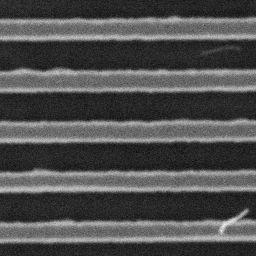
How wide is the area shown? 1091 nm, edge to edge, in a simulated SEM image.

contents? lines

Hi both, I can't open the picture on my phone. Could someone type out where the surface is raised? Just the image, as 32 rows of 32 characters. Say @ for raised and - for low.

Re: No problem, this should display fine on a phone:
--------------------------------
--------------------------------
-------------@@--@@@@@@@@@@@@@@@
@@@@@@@@@@@@@@@@@@@@@@@@@@@@@@@@
@@@@@@@@@@@@@@@@@@@@@@@@@@@@@@@@
--------------------------------
--------------------------------
--------------------------------
--------------------------------
@@@@@@@@@@@@@@@@@@@@@@@@@@@@@@@@
@@@@@@@@@@@@@@@@@@@@@@@@@@@@@@@@
--------------------------------
--------------------------------
--------------------------------
--------------------------------
@@@@@@@@@@@@@@@@@@@@@@@@@@@@@@@@
@@@@@@@@@@@@@@@@@@@@@@@@@@@@@@@@
@@@@@@@@@@@@@@@@@@@@@@-@-@@-----
--------------------------------
--------------------------------
--------------------------------
--------------------@--@@@-@-@@@
@@@@@@@@@@@@@@@@@@@@@@@@@@@@@@@@
@@@@@@@@@@@@@@@@@@@@@@@@@@@@@@@@
--------------------------------
--------------------------------
--------------------------------
--------------------------------
@@@@@@@@@@@@@@@@@@@@@@@@@@@@@@@@
@@@@@@@@@@@@@@@@@@@@@@@@@@@@@@@@
--------------------------------
--------------------------------